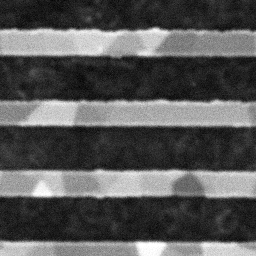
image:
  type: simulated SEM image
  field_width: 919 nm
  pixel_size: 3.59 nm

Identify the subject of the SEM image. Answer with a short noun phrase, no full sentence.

one or a few lines or trenches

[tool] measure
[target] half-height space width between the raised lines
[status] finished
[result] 0.17 um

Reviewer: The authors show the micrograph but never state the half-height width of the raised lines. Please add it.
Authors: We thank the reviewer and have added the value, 86.6 nm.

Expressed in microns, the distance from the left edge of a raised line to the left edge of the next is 0.252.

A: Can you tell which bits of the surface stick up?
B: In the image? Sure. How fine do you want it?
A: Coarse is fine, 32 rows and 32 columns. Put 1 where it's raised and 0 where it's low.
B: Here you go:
00000000000000000000000000000000
00000000000000000000000000000000
00000000000000000000000000000000
00000000000000000000000000000000
11111111111111111111111111111111
11111111111111111111111111111111
11111111111111111111111111111111
00000000000000000000000000000000
00000000000000000000000000000000
00000000000000000000000000000000
00000000000000000000000000000000
00000000000000000000000000000000
00000000000000000000000000000000
11111111111111111111111111111111
11111111111111111111111111111111
11111101111111111111111111111111
00000000000000000000000000000000
00000000000000000000000000000000
00000000000000000000000000000000
00000000000000000000000000000000
00000000000000000000000000000000
10000000000111000111111111000000
11111111111111111111111111111111
11111111111111111111111111111111
00000000000110000000000000000111
00000000000000000000000000000000
00000000000000000000000000000000
00000000000000000000000000000000
00000000000000000000000000000000
00000000000000000000000000000000
11111111111111111111111110110011
11111111111111111111111111111111